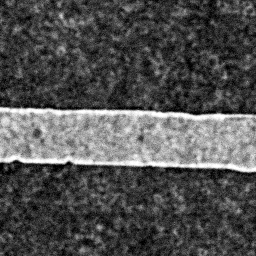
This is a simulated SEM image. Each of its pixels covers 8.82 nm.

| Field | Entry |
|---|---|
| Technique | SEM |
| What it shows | one or a few lines or trenches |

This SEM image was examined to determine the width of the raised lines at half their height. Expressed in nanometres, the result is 453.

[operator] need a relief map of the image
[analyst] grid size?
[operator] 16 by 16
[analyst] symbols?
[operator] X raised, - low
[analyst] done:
----------------
----------------
----------------
----------------
----------------
----------------
----------------
XXXXXXXXXXXXXXXX
XXXXXXXXXXXXXXXX
XXXXXXXXXXXXXXXX
--------------XX
----------------
----------------
----------------
----------------
----------------